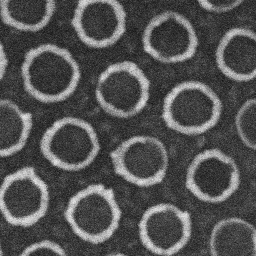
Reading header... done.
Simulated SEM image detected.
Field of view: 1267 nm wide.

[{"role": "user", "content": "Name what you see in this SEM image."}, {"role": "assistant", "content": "a regular array of raised bodies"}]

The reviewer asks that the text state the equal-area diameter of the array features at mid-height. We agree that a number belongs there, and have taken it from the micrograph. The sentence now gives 259 nm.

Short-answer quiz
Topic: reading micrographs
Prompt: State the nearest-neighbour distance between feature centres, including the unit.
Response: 350 nanometres